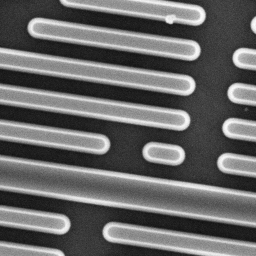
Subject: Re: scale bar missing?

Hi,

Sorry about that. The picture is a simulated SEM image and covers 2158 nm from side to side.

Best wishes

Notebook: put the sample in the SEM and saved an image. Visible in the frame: groups of lines, slits or small figures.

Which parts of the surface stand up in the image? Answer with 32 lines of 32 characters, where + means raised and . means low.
........++++++++++++++..........
..............+++++++++++.......
.....................++++.......
....++++++++....................
.....+++++++++++++..............
...........+++++++++++++........
++................+++++++.....++
+++++++++....................+++
.+++++++++++++++................
........+++++++++++++++.........
...............+++++++++........
+++++.................++.....+++
++++++++++++.................+++
.....++++++++++++++.............
............+++++++++++.........
++.................++++.....++++
+++++++++...................++++
..+++++++++++...................
.........++++.....++++..........
..................+++++.....++..
++++++......................++++
++++++++++++.................+++
+++++++++++++++++++.............
++++++++++++++++++++++++++......
.......+++++++++++++++++++++++++
..............++++++++++++++++++
++++................++++++++++++
++++++++...................+++++
....++++.....+++++..............
.............++++++++++++.......
+................+++++++++++++++
+++++++.................++++++++